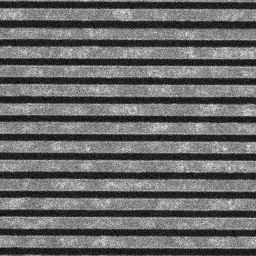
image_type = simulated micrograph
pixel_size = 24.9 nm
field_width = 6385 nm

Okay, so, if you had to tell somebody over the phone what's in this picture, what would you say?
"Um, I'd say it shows parallel lines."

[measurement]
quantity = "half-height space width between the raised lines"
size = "212 nm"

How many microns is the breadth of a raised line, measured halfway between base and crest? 0.274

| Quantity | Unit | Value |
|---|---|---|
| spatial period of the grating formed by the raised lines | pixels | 19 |